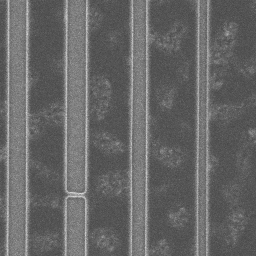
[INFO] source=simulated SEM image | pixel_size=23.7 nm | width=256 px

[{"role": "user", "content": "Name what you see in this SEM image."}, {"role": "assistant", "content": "one or a few lines or trenches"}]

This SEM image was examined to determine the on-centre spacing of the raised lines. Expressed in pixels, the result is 62.9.